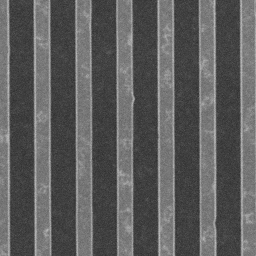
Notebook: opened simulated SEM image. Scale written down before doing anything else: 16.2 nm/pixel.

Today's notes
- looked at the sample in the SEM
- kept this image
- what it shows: parallel lines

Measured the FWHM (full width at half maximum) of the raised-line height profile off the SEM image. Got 0.243 µm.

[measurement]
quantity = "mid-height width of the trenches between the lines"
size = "26.7 px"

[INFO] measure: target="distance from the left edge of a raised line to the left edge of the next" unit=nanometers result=668